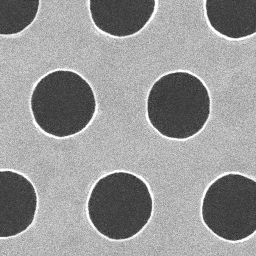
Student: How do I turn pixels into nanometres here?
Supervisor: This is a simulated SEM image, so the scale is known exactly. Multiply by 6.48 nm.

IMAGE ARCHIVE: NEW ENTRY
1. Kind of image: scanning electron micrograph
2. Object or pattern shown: holes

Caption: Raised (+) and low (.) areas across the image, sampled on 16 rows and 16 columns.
..++++....+++...
..++++...++++...
++++++++++++++++
++++++++++++++++
+++.++++++++++++
++....+++....+++
++....+++....+++
++....+++....+++
++++++++++..++++
++++++++++++++++
++++++++++++++++
..++++...++++...
..++++...++++...
..++++...++++...
.+++++...++++...
++++++++++++++++